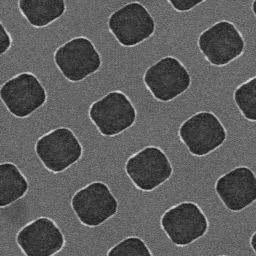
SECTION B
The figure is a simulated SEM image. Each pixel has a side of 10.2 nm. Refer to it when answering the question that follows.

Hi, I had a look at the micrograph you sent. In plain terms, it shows a regular array of holes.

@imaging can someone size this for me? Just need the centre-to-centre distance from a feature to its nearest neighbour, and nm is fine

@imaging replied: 658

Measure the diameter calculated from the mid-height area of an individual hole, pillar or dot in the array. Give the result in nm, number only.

432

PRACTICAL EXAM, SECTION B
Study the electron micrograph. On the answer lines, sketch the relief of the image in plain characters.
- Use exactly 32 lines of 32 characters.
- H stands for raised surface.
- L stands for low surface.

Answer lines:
HHLLLLLLHHHHHHHHLHHHHLLLLHHHHHHH
HHHLLLLLHHHHHHLLLLHHHHHHHHHHHHHH
HHHLLLLHHHHHHHLLLLLHHHHHHHHHHHHH
HHHHHHHHHHHHHHLLLLLHHHHHHHLLLHHH
LHHHHHHHHHHHHHLLLLLHHHHHHLLLLLHH
LHHHHHHHLLLHHHHLLHHHHHHHHLLLLLHH
LHHHHHHLLLLLHHHHHHHHHHHHHLLLLLHH
HHHHHHHLLLLLHHHHHHHHLLHHHHLLLHHH
HHHHHHHLLLLLHHHHHHHLLLLHHHHHHHHH
HHLLHHHHLLLHHHHHHHLLLLLLHHHHHHHH
HLLLLHHHHHHHHHHHHHLLLLLLHHHHHHLL
LLLLLLHHHHHHHHHHHHHLLLLHHHHHHLLL
LLLLLLHHHHHHLLLLHHHHLHHHHHHHHLLL
HLLLLHHHHHHLLLLLLHHHHHHHHHHHHHLL
HHLHHHHHHHHLLLLLLHHHHHHHLLLHHHHL
HHHHHHHHHHHHLLLLHHHHHHHLLLLLHHHH
HHHHHHLLLHHHHLLHHHHHHHLLLLLLHHHH
HHHHHLLLLLHHHHHHHHHHHHHLLLLLHHHH
HHHHHLLLLLHHHHHHHHLLHHHHLLLHHHHH
HHHHHLLLLLHHHHHHHLLLLHHHHHHHHHHH
HHHHHHLLLHHHHHHHLLLLLHHHHHHHHHHH
LLHHHHHHHHHHHHHHLLLLLHHHHHHHHLLH
LLLHHHHHHHHHHHHHHLLLLHHHHHHLLLLL
LLLHHHHHHHLLLHHHHLLHHHHHHHHLLLLL
LLLHHHHHHLLLLLHHHHHHHHHHHHHLLLLL
LHHHHHHHHLLLLLLHHHHHHHHLHHHHLLLH
HHHHHHHHHLLLLLHHHHHHHLLLLHHHHHHH
HHHHHLHHHHLLLHHHHHHHLLLLLLHHHHHH
HHHLLLLHHHHHHHHHHHHHLLLLLLHHHHHH
HHLLLLLLHHHHHHHHHHHHHLLLLHHHHHHH
HHLLLLLLHHHHHHHLLLHHHHLHHHHHHHHL
HHHLLLLHHHHHHHLLLLLHHHHHHHHHHHHH